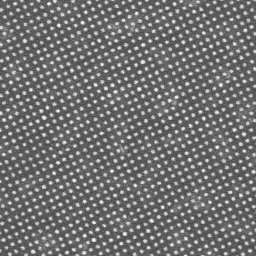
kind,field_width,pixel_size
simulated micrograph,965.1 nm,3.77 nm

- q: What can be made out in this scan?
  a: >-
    a regular array of raised bodies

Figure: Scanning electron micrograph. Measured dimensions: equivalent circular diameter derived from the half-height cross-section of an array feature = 12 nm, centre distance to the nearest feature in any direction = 27.1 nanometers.